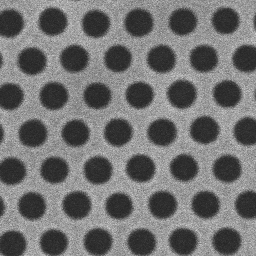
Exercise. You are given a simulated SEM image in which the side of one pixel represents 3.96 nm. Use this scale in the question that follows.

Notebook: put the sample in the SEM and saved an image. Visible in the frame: a regular array of holes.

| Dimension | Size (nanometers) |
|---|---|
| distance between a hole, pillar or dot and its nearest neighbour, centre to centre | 165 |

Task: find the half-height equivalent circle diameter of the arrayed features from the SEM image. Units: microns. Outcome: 0.115